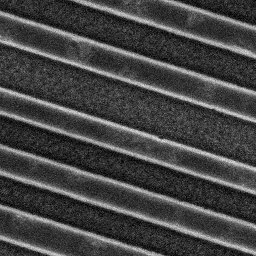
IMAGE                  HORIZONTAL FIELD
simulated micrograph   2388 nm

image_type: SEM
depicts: one or a few lines or trenches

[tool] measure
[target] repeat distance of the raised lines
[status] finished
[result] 586 nanometres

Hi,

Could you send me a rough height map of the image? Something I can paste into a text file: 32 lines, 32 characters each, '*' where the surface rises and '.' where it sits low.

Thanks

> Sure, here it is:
...........************.........
..............************......
***..............************...
******..............************
*********..............*********
.************..............*****
....************..............**
.......************.............
...........***********..........
..............***********.......
.................************...
*...................************
*****..................*********
********...................*****
.**********...................**
....**********..................
.......**********...............
..........**********............
*.............**********........
****.............**********.....
*******.............**********..
***********............*********
..************............******
......***********.............**
.........***********............
............***********.........
***............***********......
******.............***********..
*********.............**********
************.............*******
..*************.............****
.....*************.............*